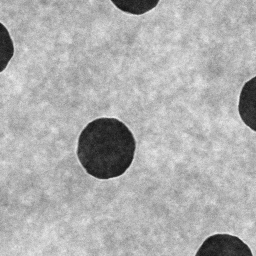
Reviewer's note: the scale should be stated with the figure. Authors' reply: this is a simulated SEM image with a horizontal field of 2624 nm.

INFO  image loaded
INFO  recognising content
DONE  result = holes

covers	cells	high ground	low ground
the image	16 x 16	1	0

1111111000111111
1111111111111111
0111111111111111
0111111111111111
1111111111111111
1111111111111110
1111111111111110
1111110111111110
1111100011111111
1111100011111111
1111100011111111
1111111111111111
1111111111111111
1111111111111111
1111111111111111
1111111111110000